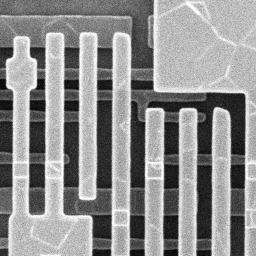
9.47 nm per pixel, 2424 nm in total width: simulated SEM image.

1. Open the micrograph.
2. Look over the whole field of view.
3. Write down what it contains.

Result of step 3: wiring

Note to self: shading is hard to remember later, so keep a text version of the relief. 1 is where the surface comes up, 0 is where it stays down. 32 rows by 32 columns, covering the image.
00000000000000000001111111111111
00000000000000000001111111111111
00000000000000000001111111111111
00000000000000000001111111111111
00000011001100110001111111111111
00110011001100110001111111111111
00110011001100110001111111111111
01110011001100110001111111111111
01110011001100110001111111111111
01110011001100110001111111111111
01110011001100110001111111111111
00110011001100110000000000001111
00110011001100110000000000000001
00110011001100110000000000000001
00110011001100110011001110011001
00110011001100110011001110011001
00110011001100110011001110011001
00110011001100110011001110011001
00110011001100110011001110011001
00110011001100110011001110011001
00110011001100110011001110011001
00110011001100110011001110011001
00110011001100110011001110011001
00100011001100110011001110011001
00100011001100110011001100011001
00100011000000110011001110011001
00110011000000110011001110011001
01111111111000110011001100011001
01111111111000110011001110011001
01111111111000110011001110011001
01111111111000110011001110011001
01111111111000110011001100011001